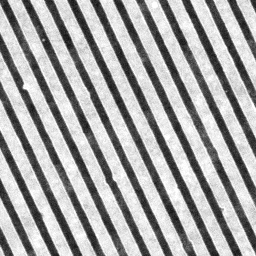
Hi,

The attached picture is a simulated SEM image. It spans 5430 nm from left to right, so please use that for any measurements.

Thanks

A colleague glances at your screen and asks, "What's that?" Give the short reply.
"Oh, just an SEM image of parallel lines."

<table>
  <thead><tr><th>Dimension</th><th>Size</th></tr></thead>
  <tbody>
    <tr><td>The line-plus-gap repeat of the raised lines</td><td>0.438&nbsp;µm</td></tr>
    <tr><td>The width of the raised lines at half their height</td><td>218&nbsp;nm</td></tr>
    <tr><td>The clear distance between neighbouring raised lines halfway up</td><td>10.3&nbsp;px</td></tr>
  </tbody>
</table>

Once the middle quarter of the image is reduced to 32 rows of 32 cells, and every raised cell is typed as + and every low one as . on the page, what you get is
...++...+++...+++...++...+++...+
...+++...+++...++...+++...+++...
+...++...+++...+++...++...+++...
+...+++...++...+++...+++...+++..
++..+++...+++...+++...++...+++..
++...+++...++...+++...+++...++..
+++..+++...+++...+++...++...+++.
+++...+++...++...+++...+++...++.
.++...+++...+++...+++..+++...+++
.+++...+++...++...+++...+++...++
..++...+++...+++...++...+++...++
..+++...+++...++...+++...+++..++
...++...+++...+++...++...+++...+
...+++...++...+++...+++...+++...
+..+++...+++...+++...++...+++...
+...+++...++...+++...+++...+++..
+...+++...+++...+++...++...+++..
++...+++...++...+++...+++...++..
++...+++...+++...+++...++...+++.
+++...+++...++...+++...+++...++.
.++...+++...+++...+++..+++...+++
.+++...++...+++...+++...+++...++
..++...+++...+++...++...+++...++
..+++...+++..+++...+++...+++...+
..+++...+++...+++...++...+++...+
...+++...++...+++...+++...+++..+
...+++...+++...+++...++...+++...
+...+++...++...+++...+++...+++..
+...+++...++....+++...++...+++..
++...+++..+++...+++...+++...++..
++...+++...+++...++...+++...+++.
+++...+++...++...+++...+++..+++.